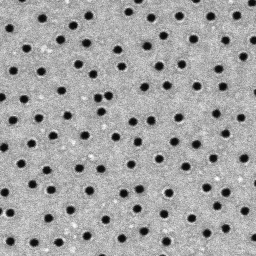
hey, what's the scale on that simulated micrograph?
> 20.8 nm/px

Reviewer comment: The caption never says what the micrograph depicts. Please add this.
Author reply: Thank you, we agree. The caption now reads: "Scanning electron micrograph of a regular array of holes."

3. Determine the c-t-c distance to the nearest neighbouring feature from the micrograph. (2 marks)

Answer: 464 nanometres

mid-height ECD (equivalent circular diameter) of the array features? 0.192 microns